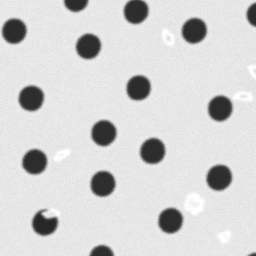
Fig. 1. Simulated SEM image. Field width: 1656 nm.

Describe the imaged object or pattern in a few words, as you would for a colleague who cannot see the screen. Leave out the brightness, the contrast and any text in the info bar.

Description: a regular array of holes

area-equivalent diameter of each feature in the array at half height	0.17	micrometres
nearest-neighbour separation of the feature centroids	411	nm